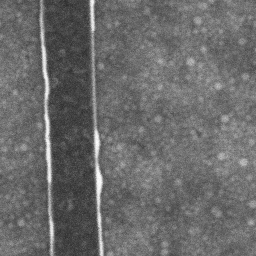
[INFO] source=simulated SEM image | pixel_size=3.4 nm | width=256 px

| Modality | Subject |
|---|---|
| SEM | one or a few lines or trenches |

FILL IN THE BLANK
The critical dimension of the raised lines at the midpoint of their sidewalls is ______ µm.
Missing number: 0.175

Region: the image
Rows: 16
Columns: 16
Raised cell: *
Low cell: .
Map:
...***..........
...***..........
...***..........
...***..........
...***..........
...***..........
...***..........
...***..........
...***..........
...***..........
...***..........
...***..........
...***..........
...***..........
...***..........
...***..........